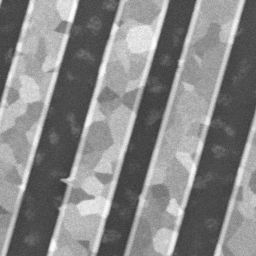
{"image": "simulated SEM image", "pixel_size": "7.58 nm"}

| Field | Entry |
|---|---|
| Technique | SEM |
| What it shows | one or a few lines or trenches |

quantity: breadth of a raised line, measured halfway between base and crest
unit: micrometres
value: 0.312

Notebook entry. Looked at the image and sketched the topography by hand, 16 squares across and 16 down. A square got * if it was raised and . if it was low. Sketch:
..***...**..***.
..**...***..***.
.***...***..**..
.***...**..***..
.**...***..***..
***...***..***..
***...***..**...
***...**..***...
**...***..***...
**...***..**...*
**...**..***...*
*...***..***...*
*...***..***...*
*...***..**...**
*...**..***...**
...***..***...**